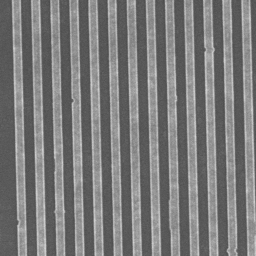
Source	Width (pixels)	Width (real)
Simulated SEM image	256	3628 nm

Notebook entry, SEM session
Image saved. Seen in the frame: parallel lines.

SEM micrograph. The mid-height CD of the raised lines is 112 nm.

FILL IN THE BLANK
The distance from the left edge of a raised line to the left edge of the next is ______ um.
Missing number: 0.271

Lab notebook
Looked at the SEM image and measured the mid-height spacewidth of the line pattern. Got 163 nm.